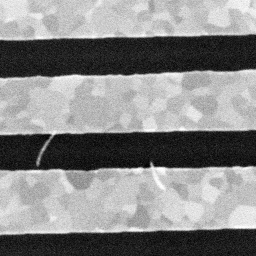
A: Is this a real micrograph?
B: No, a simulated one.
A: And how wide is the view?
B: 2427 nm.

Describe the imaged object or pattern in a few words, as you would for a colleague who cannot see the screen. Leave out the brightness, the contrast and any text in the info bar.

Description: lines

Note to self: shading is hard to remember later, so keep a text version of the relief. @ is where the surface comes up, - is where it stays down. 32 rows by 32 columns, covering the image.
@@@@@@@@@@@@@@@@@@@@@@@@@@@@@@@@
@@@@@@@@@@@@@@@@@@@@@@@@@@@@@@@@
@@@@@@@@@@@@@@@@@@@@@@@@@@@@@@@@
@@@@@@@@@@@@@@@@@@@@@@@@@@@@@@@@
@@@@@@@@@@@@@@@@@@@@------------
--------------------------------
--------------------------------
--------------------------------
--------------------------------
---------@---@@@@@@@@@@@@@@@@@@@
@@@@@@@@@@@@@@@@@@@@@@@@@@@@@@@@
@@@@@@@@@@@@@@@@@@@@@@@@@@@@@@@@
@@@@@@@@@@@@@@@@@@@@@@@@@@@@@@@@
@@@@@@@@@@@@@@@@@@@@@@@@@@@@@@@@
@@@@@@@@@@@@@@@@@@@@@@@@@@@@@@@@
@@@@@@@@@@@@@@@@@@@@@@@@@@@@@@@@
@@@@@@@@@@@@@@@@@---------------
--------------------------------
--------------------------------
--------------------------------
--------------------------------
@@@@@@@@@@@@@@@@@@@@@@@@@@@@@@@@
@@@@@@@@@@@@@@@@@@@@@@@@@@@@@@@@
@@@@@@@@@@@@@@@@@@@@@@@@@@@@@@@@
@@@@@@@@@@@@@@@@@@@@@@@@@@@@@@@@
@@@@@@@@@@@@@@@@@@@@@@@@@@@@@@@@
@@@@@@@@@@@@@@@@@@@@@@@@@@@@@@@@
@@@@@@@@@@@@@@@@@@@@@@@@@@@@@@@@
@@@@@@@@@@@@@@@@@@@@@@@@@@@@----
--------------------------------
--------------------------------
--------------------------------